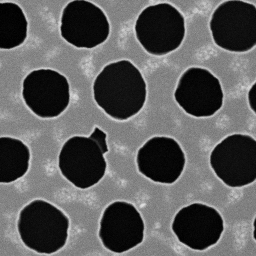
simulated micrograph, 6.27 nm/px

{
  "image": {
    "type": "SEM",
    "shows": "a regular array of holes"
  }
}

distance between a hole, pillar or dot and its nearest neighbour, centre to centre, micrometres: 0.475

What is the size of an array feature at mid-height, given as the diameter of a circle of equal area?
300 nanometers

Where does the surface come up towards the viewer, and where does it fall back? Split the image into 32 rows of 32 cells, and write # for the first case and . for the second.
..#######...########.#######...#
...#####.....#####....#####.....
...#####.....####......###......
...#####......###......###......
...#####.....####......####.....
..#######....#####.....####.....
###################..###########
################################
#############....#######.#######
###.....####......#####....#####
###......###......####.....#####
###......###......####......###.
###......###......####......###.
####....#####.....#####....####.
#####..#######..########..######
################################
############.###################
..#######....######...######....
...#####.....#####.....####.....
....###......####......###......
....###......####......###......
...#####.....#####.....####.....
..#######...#######...######....
##########.#####################
################################
####..########..########.#######
###.....#####....#####.....#####
##......#####.....####......####
##......#####.....####......####
###.....#####.....####......####
###.....#####....######....#####
#####..#######.#################